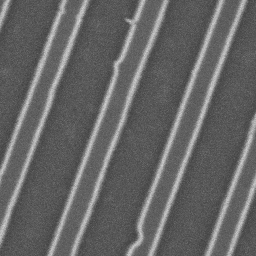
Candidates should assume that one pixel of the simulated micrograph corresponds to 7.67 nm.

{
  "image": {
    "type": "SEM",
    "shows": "one or a few lines or trenches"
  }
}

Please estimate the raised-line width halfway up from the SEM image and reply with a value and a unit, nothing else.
0.153 um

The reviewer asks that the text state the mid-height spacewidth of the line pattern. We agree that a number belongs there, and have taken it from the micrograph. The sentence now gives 414 nm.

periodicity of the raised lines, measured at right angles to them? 567 nm